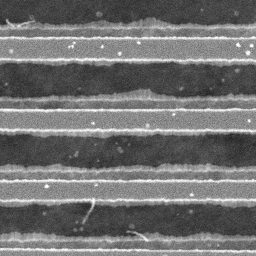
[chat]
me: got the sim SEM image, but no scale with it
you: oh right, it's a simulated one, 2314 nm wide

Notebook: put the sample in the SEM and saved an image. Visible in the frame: lines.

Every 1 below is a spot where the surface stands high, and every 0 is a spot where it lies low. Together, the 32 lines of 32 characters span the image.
00000000000000000000000000000000
00000000000000000000000000000000
00000000000000000000000000000000
11111111111111111111111111111111
11111111111111111111111111111111
11111111111111111111111111111111
11111111111111111111111111111111
11111111111111111111111111111111
00000000000000000000000000000000
00000000000000000000000000000000
00000000000000000000000000000000
00000000000000000000000000000000
11111111111111111111111111111111
11111111111111111111111111111111
11111111111111111111111111111111
11111111111111111111111111111111
00000100000011000000000000000000
00000000000000000000000000000000
00000000000000000000000000000000
00000000000000000000000000000000
00000000000000000000000000000000
11111111111111111111111111111111
11111111111111111111111111111111
11111111111111111111111111111111
11111111111111111111111111111111
00000000000000000000000000000000
00000000000000000000000000000000
00000000000000000000000000000000
00000000000000000000000000000000
00000000000000000000000000000000
11111111111111111111111111111111
11111111111111111111111111111111